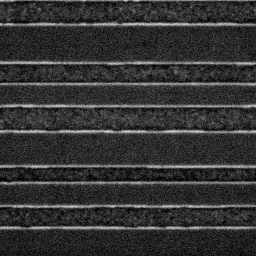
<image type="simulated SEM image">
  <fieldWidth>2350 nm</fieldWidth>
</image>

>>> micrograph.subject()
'lines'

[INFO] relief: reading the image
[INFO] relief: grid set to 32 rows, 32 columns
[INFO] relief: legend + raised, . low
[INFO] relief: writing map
................................
................................
................................
++++++++++++++++++++++++++++++++
++++++++++++++++++++++++++++++++
++++++++++++++++++++++++++++++++
++++++++++++++++++++++++++++++++
++++++++++++++++++++++++++++++++
................................
................................
++++++++++++++++++++++++++++++++
++++++++++++++++++++++++++++++++
++++++++++++++++++++++++++++++++
................................
................................
................................
++++++++++++++++++++++++++++++++
++++++++++++++++++++++++++++++++
++++++++++++++++++++++++++++++++
++++++++++++++++++++++++++++++++
++++++++++++++++++++++++++++++++
................................
................................
++++++++++++++++++++++++++++++++
++++++++++++++++++++++++++++++++
++++++++++++++++++++++++++++++++
................................
................................
+++.+++++++++.....+.....++++++++
++++++++++++++++++++++++++++++++
++++++++++++++++++++++++++++++++
++++++++++++++++++++++++++++++++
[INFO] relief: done